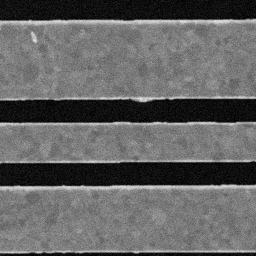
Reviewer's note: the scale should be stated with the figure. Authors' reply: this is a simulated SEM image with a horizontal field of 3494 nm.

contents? lines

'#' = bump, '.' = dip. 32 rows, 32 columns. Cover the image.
................................
................................
................................
################################
################################
################################
################################
################################
################################
################################
################################
################################
................................
................................
................................
################################
################################
################################
################################
################################
................................
................................
................................
################################
################################
################################
################################
################################
################################
################################
################################
####............................